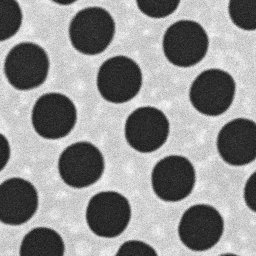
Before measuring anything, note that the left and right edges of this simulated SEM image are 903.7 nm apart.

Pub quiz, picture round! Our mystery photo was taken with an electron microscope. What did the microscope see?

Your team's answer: a regular array of holes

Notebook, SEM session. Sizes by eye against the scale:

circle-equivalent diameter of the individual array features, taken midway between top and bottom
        163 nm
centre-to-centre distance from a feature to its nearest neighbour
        197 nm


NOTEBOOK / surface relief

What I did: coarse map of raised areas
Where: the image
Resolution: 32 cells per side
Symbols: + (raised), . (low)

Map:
..++++++.++++++++.....+++++++...
...+++++++...+++++....+++++++...
...++++++.....+++++++++++++++...
..+++++++.....+++++++....+++++..
.++++++++.....++++++......++++++
++..+++++.....++++++......++++++
+.....++++...+++++++......++++++
+.....+++++++....++++....+++++++
+.....++++++.....+++++++++++++++
+.....++++++......+++++++....+++
+....+++++++......++++++.....+++
++++++++++++.....+++++++.....+++
+++++....++++...++++++++.....+++
++++.....++++++++..+++++.....+++
++++......++++++.....+++++++++++
++++.....+++++++.....+++++++....
+++++....+++++++.....++++++.....
.+++++++++++++++.....++++++.....
.+++++++....+++++...+++++++.....
.++++++......++++++++..+++++....
.++++++......+++++++....+++++..+
+++++++......++++++.....++++++++
+..+++++....+++++++.....+++++++.
....+++++++++++++++.....+++++++.
.....+++++++...+++++...++++++++.
.....++++++.....+++++++++++++++.
....+++++++.....+++++++....+++++
....+++++++.....+++++++.....++++
++++..+++++.....++++++......++++
+++....+++++...+++++++......++++
+++.....+++++++...+++++....+++++
++......+++++++....+++++++++++++